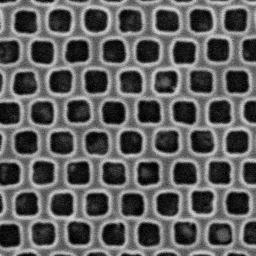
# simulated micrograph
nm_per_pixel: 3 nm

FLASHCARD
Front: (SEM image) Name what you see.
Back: a regular array of holes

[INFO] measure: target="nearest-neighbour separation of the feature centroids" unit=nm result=102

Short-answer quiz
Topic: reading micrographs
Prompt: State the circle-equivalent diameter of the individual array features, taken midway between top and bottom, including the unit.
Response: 77.1 nm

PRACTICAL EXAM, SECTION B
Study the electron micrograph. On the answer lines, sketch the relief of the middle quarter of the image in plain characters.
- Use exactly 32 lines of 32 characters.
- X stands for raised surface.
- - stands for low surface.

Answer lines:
XXXXXXXXXXXXXXXXXXXXXXXXXXXXXXXX
-XXXXX---XXXXXXX--XXXXXX---XXXXX
--XXX------XXX-----XXXX-----XXX-
--XXX------XXX-----XXXX------XX-
--XXX------XXX------XXX------XX-
--XXX------XXX------XX------XXX-
--XXX------XXX-----XXXX-----XXXX
-XXXXXX---XXXXX---XXXXXX---XXXXX
XXXXXXXXXXXXXXXXXXXXXXXXXXXXXXXX
X-----XXXX----XXXX-----XXXXX----
X-----XXXX-----XXX------XXX-----
X------XX-------XX------XXX-----
X------XX-------XX------XXX-----
X------XXX-----XXX------XXX-----
X-----XXXX-----XXXX-----XXXX----
XXXXXXXXXXXXXXXXXXXXXXXXXXXXXXXX
XXXXXXXXXXXXXXX--XXXXXXX----XXXX
--XXXX-----XXX-----XXXX------XX-
---XX------XXX------XXX------XX-
---XX------XXX------XX-------XXX
---XX------XXX------XXX------XX-
---XX------XXX------XXX------XXX
-XXXXX----XXXXX---XXXXXXXXXXXXXX
XXXXXXXXXXXXXXXXXXXXXXXXXXXXXXXX
XX----XXXX----XXXXX----XXXXX----
X-----XXX------XXX------XXX-----
-------XX------XXX------XXX-----
X------XX-------XX------XXX-----
X------XX-------XX------XXX-----
X-----XXXX-----XXX------XXX-----
XXXXXXXXXXXXXXXXXXX--XXXXXXXXXXX
XXXXXXXXXXXXXXXXXXXXXXXXXXXXXXXX